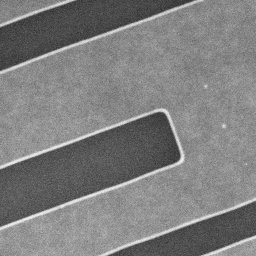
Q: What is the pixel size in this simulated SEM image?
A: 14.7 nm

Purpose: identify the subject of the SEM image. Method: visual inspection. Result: groups of lines, slits or small figures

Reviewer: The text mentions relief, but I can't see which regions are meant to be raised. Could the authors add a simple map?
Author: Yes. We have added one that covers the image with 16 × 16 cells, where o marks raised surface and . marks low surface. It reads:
ooo........ooooo
........oooooooo
.....ooooooooooo
...ooooooooooooo
oooooooooooooooo
oooooooooooooooo
oooooooooooooooo
oooooooo...ooooo
ooooo......ooooo
ooo........ooooo
..........oooooo
........oooooooo
.....ooooooooooo
..ooooooooooo...
oooooooooo......
oooooooo......oo